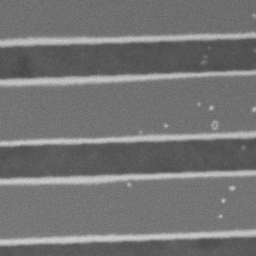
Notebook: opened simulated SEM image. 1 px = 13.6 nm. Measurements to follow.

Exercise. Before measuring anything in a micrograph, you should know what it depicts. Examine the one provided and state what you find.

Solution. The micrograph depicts lines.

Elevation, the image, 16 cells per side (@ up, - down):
@@@@@@@@@@@@@@@@
@@@@@@@@@@@@@@@@
@@@@@@@@@@------
----------------
---------------@
@@@@@@@@@@@@@@@@
@@@@@@@@@@@@@@@@
@@@@@@@@@@@@@@@@
@@@@@@@@@@@@@@@@
----------------
----------------
@@@@@@@@@@@@@@@@
@@@@@@@@@@@@@@@@
@@@@@@@@@@@@@@@@
@@@@@@@@@@@@@@@@
----------------